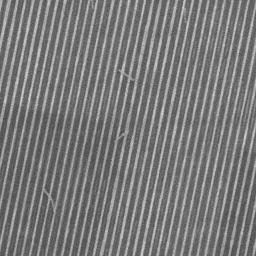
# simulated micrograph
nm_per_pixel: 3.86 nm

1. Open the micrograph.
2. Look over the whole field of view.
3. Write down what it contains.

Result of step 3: parallel lines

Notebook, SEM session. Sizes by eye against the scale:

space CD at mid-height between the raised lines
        23.7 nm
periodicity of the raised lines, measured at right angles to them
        0.0302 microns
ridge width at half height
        6.6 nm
